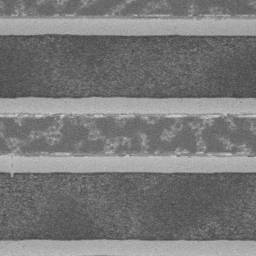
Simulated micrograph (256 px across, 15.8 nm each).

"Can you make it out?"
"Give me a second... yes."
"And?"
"one or a few lines or trenches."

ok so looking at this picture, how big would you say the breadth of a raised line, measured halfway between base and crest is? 938 nm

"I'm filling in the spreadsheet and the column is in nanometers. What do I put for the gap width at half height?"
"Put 1260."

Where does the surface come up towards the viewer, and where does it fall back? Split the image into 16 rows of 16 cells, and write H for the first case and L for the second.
HHHHHHHHHHHHHHHH
HHHHHHHHHHHHHHHH
LLLLLLLLLLLLLLLL
LLLLLLLLLLLLLLLL
LLLLLLLLLLLLLLLL
LLLLLLLLLLLLLLLL
LLLLLLLLLLLLLLLL
HHHHHHHHHHHHHHHH
HHHHHHHHHHHHHHHH
HHHHHHHHHHHHHHHH
LLLLLLLLLLLLLLLL
LLLLLLLLLLLLLLLL
LLLLLLLLLLLLLLLL
LLLLLLLLLLLLLLLL
LLLLLLLLLLLLLLLL
LLHLHHHHLLLLLLLL